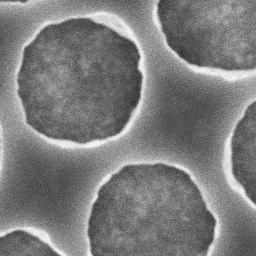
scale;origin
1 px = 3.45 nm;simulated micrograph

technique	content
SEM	holes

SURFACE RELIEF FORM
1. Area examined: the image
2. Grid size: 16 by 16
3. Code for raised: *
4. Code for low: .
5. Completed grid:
**********......
***....***......
**......**......
*........**.....
*........****...
*........*******
*........*******
**......*******.
***....********.
**************..
********...***..
*******.....***.
******.......***
******.......***
*.***........***
...***.......***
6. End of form